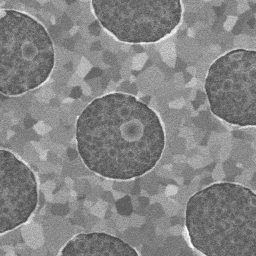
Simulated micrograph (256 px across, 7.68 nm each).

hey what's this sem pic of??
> holes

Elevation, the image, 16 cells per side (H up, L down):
HHHHHHLLLLLHHHHH
LLLHHHLLLLLHHHHH
LLLHHHHHLLHHHHHH
LLLHHHHHHHHHHHLL
LLLHHHHHHHHHHLLL
LLHHHHHHHHHHHLLL
HHHHHHLLLHHHHLLL
HHHHHLLLLLHHHHLL
HHHHHLLLLLHHHHHH
LHHHHLLLLLHHHHHH
LLHHHHLLLHHHHHHH
LLHHHHHHHHHHHLLH
LLHHHHHHHHHHLLLL
LLHHHHHHHHHHLLLL
HHHHHHHHHHHHLLLL
HHHHLLLLHHHHLLLL